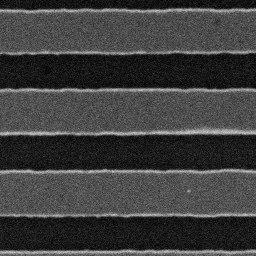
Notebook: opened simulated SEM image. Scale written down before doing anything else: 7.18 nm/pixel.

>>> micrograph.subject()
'lines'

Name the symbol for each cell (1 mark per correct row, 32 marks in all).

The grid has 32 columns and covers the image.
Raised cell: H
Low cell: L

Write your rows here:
LLLLLLLLLLLLLLLLLLLLLLLLLLLLLLLL
HHHHHHHHHHHHHHHHHHHHHHHHHHHHHHHH
HHHHHHHHHHHHHHHHHHHHHHHHHHHHHHHH
HHHHHHHHHHHHHHHHHHHHHHHHHHHHHHHH
HHHHHHHHHHHHHHHHHHHHHHHHHHHHHHHH
HHHHHHHHHHHHHHHHHHHHHHHHHHHHHHHH
HHHHHHHHHHHHHHHHHHHHHHHHHHHHHHHH
LLLLLLLLLLLLLLLLLLLLLLLLLLLLLLLL
LLLLLLLLLLLLLLLLLLLLLLLLLLLLLLLL
LLLLLLLLLLLLLLLLLLLLLLLLLLLLLLLL
LLLLLLLLLLLLLLLLLLLLLLLLLLLLLLLL
HHHHHHHHHHHHHHHHHHHHHHHHHHHHHHHH
HHHHHHHHHHHHHHHHHHHHHHHHHHHHHHHH
HHHHHHHHHHHHHHHHHHHHHHHHHHHHHHHH
HHHHHHHHHHHHHHHHHHHHHHHHHHHHHHHH
HHHHHHHHHHHHHHHHHHHHHHHHHHHHHHHH
HHHHHHHHHHHHHHHHHHHHHHHHHHHHHHHH
LLLLLLLLLLLLLLLLLLLLLLLLLLLLLLLL
LLLLLLLLLLLLLLLLLLLLLLLLLLLLLLLL
LLLLLLLLLLLLLLLLLLLLLLLLLLLLLLLL
LLLLLLLLLLLLLLLLLLLLLLLLLLLLLLLL
HHHHHHHHHHHHHHHHHHHHHHHHHHHHHHHH
HHHHHHHHHHHHHHHHHHHHHHHHHHHHHHHH
HHHHHHHHHHHHHHHHHHHHHHHHHHHHHHHH
HHHHHHHHHHHHHHHHHHHHHHHHHHHHHHHH
HHHHHHHHHHHHHHHHHHHHHHHHHHHHHHHH
HHHHHHHHHHHHHHHHHHHHHHHHHHHHHHHH
LLLLLLLLLLLLLLLLLLLLLLLLLLLLLLLL
LLLLLLLLLLLLLLLLLLLLLLLLLLLLLLLL
LLLLLLLLLLLLLLLLLLLLLLLLLLLLLLLL
LLLLLLLLLLLLLLLLLLLLLLLLLLLLLLLL
HHHHHHHHHHHHHHHHHHHHHHHHHHHHHHHH